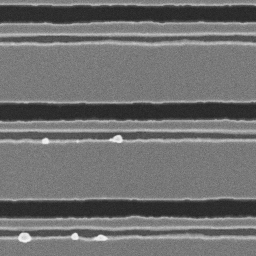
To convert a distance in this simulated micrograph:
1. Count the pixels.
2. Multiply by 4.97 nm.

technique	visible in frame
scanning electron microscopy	lines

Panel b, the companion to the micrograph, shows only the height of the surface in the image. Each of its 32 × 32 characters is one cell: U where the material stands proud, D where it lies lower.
UUUUUUUUUUUUUUUUUUUUUUUUUUUUUUUU
DDDDDDDDDDDDDDDDDDDDDDDDDDDDDDDD
DDDDDDDDDDDDDDDDDDDDDDDDDDDDDDDD
UUUUUUUUUUUUUUUUUUUUUUUUUUUUUUUU
UUUUUUUUUUUUUUUUUUUUUUUUUUUUUUUU
UUUUUUUUUUUUUUUUUUUUUUUUUUUUUUUU
UUUUUUUUUUUUUUUUUUUUUUUUUUUUUUUU
UUUUUUUUUUUUUUUUUUUUUUUUUUUUUUUU
UUUUUUUUUUUUUUUUUUUUUUUUUUUUUUUU
UUUUUUUUUUUUUUUUUUUUUUUUUUUUUUUU
UUUUUUUUUUUUUUUUUUUUUUUUUUUUUUUU
UUUUUUUUUUUUUUUUUUUUUUUUUUUUUUUU
UUUUUUUUUUUUUUUUUUUUUUUUUUUUUUUU
DDDDDDDDDDDDDDDDDDDDDDDDDDDDDDDD
DDDDDDDDDDDDDDDDDDDDDDDDDDDDDDDD
UUUUUUUUUUUUUUUUUUUUUUUUUUUUUUUU
UUUUUUUUUUUUUUUUUUUUUUUUUUUUUUUU
UUUUUUUUUUUUUUUUUUUUUUUUUUUUUUUU
UUUUUUUUUUUUUUUUUUUUUUUUUUUUUUUU
UUUUUUUUUUUUUUUUUUUUUUUUUUUUUUUU
UUUUUUUUUUUUUUUUUUUUUUUUUUUUUUUU
UUUUUUUUUUUUUUUUUUUUUUUUUUUUUUUU
UUUUUUUUUUUUUUUUUUUUUUUUUUUUUUUU
UUUUUUUUUUUUUUUUUUUUUUUUUUUUUUUU
UUUUUUUUUUUUUUUUUUUUUUUUUUUUUUUU
DDDDDDDDDDDDDDDDDDDDDDDDDDDDDDDD
DDDDDDDDDDDDDDDDDDDDDDDDDDDDDDDD
UUUUUUUUUUUUUUUUUUUUUUUUUUUUUUUU
UUUUUUUUUUUUUUUUUUUUUUUUUUUUUUUU
UUUUUUUUUUUUUUUUUUUUUUUUUUUUUUUU
UUUUUUUUUUUUUUUUUUUUUUUUUUUUUUUU
UUUUUUUUUUUUUUUUUUUUUUUUUUUUUUUU